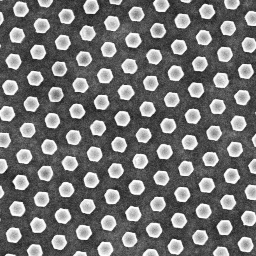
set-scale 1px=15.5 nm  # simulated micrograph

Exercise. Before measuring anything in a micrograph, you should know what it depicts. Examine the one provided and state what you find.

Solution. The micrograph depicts a regular array of raised bodies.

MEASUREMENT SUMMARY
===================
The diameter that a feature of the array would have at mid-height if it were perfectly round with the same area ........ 223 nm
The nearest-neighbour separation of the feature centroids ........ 405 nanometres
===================